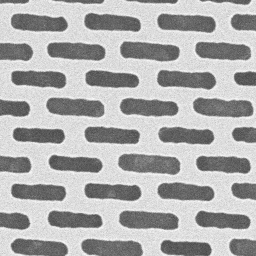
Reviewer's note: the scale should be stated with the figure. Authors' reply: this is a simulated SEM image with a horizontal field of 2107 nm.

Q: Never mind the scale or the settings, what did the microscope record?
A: a regular array of holes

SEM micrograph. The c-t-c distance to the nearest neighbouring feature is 378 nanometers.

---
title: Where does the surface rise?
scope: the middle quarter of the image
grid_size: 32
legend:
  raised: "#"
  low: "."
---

################################
################################
#####............######.........
.####.............#####.........
.####..............####.........
#######...........######........
################################
################################
..##.##########...##############
.........#####..............####
..........####...............###
..........####...............###
..........#####.............####
################################
################################
################################
#####.............######........
#####..............####.........
#####..............#####........
######............#######.......
################################
################################
###############.....############
........######..............####
.........#####...............###
..........####...............###
.........######..............###
########################....####
################################
################################
#####..............#####........
.####..............####.........